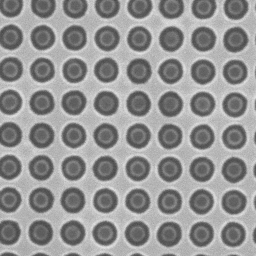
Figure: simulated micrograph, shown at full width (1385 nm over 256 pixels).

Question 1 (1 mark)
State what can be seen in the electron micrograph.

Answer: a regular array of ring-shaped grooves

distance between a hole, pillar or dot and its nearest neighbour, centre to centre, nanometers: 172